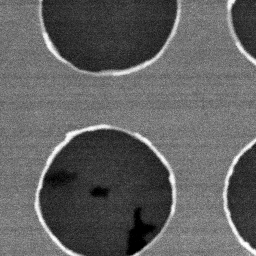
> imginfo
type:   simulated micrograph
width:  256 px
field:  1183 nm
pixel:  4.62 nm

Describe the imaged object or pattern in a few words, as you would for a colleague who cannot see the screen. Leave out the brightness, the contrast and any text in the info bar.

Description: holes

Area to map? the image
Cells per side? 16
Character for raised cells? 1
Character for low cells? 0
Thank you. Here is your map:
1110000000011100
1110000000011100
1110000000111110
1111000000111111
1111110111111111
1111111111111111
1111111111111111
1111111111111111
1111100011111111
1111000000111110
1110000000111110
1110000000011100
1100000000011100
1110000000011100
1110000000111110
1111000001111111